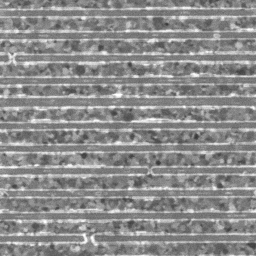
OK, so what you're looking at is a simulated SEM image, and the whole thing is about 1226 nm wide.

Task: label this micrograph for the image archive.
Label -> parallel lines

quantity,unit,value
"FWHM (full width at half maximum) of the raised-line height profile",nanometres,71.3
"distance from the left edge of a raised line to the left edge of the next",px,22.6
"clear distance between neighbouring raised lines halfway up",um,0.0377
